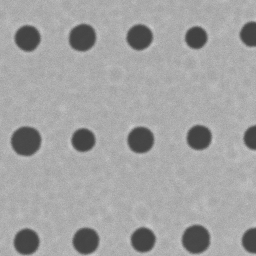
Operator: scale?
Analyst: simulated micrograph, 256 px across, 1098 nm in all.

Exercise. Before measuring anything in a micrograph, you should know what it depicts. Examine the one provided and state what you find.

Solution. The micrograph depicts a regular array of holes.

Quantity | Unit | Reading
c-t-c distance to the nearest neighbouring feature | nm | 243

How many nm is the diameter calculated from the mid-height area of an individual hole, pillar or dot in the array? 114